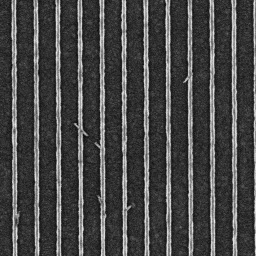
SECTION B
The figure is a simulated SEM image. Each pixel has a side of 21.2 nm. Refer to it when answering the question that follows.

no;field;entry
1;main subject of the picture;parallel lines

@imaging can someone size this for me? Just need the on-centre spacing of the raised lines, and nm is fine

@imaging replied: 467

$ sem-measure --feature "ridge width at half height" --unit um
0.0637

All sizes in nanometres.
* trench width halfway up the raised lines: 401